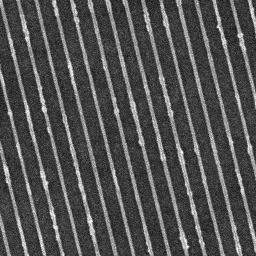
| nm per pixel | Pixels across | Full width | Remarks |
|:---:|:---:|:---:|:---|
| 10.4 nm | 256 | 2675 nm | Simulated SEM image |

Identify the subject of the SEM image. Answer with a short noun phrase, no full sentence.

parallel lines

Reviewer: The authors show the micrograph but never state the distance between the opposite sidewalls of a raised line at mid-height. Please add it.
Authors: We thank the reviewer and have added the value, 35.6 nm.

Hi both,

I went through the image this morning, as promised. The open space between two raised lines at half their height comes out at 145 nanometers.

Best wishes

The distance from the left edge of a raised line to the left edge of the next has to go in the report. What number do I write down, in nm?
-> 181